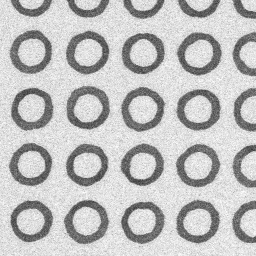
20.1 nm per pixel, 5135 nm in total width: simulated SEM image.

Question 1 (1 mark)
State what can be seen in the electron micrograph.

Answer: a regular array of ring-shaped grooves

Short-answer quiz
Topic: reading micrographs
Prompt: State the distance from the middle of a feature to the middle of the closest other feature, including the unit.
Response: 1.1 microns